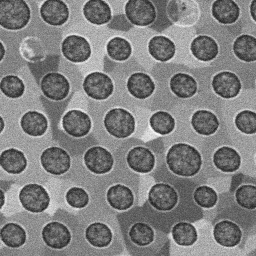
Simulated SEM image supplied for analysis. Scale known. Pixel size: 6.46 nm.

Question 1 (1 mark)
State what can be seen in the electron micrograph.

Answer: a regular array of holes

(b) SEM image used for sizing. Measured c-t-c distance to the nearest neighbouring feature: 0.275 um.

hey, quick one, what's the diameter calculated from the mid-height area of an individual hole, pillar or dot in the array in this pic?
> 178 nanometers